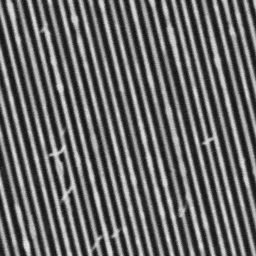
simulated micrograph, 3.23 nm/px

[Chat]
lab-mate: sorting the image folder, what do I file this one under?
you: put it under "parallel lines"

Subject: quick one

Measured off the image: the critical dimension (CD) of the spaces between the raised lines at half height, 20.4 nm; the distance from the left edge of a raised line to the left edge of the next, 32.3 nm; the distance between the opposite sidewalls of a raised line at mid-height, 11.7 nm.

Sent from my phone